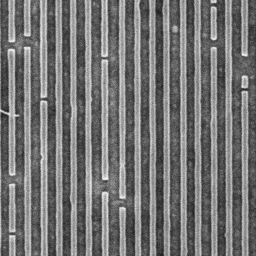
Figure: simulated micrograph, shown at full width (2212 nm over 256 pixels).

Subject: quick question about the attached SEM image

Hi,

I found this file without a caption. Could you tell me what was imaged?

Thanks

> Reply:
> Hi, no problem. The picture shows parallel lines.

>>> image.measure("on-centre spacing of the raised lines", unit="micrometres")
0.134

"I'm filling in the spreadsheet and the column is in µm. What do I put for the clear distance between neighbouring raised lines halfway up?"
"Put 0.0886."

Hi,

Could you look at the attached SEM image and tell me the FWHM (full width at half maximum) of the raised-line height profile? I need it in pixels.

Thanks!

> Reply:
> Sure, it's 5.13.